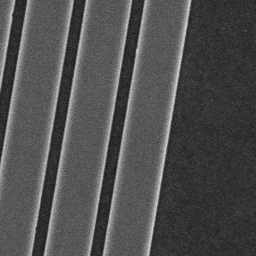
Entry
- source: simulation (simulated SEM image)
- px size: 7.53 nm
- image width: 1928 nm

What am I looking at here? parallel lines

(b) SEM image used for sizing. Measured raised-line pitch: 436 nm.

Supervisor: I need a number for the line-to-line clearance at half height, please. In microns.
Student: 0.0928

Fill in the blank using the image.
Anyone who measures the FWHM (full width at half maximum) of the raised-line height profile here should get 339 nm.